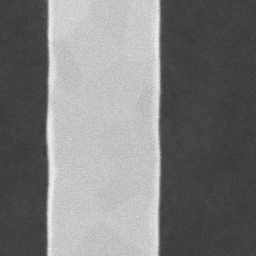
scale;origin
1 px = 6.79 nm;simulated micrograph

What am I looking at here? wiring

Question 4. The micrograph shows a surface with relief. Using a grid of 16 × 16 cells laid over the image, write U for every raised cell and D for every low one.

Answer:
DDDUUUUUUUDDDDDD
DDDUUUUUUUDDDDDD
DDDUUUUUUUDDDDDD
DDDUUUUUUUDDDDDD
DDDUUUUUUUDDDDDD
DDDUUUUUUUDDDDDD
DDDUUUUUUUDDDDDD
DDDUUUUUUUDDDDDD
DDDUUUUUUUDDDDDD
DDDUUUUUUUDDDDDD
DDDUUUUUUUDDDDDD
DDDUUUUUUUDDDDDD
DDDUUUUUUUDDDDDD
DDDUUUUUUUDDDDDD
DDDUUUUUUUDDDDDD
DDDUUUUUUUDDDDDD